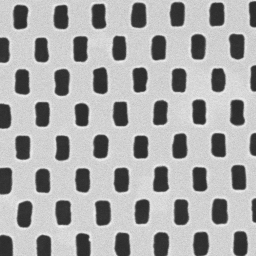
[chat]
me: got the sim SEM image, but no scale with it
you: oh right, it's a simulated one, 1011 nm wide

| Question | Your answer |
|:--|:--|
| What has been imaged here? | a regular array of holes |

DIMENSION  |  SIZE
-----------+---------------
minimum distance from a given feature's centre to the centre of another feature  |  148 nanometers